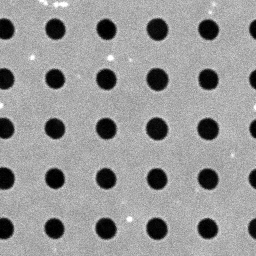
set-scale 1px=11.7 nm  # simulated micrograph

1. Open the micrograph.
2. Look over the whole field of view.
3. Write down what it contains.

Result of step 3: a regular array of holes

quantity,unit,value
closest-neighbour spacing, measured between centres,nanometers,578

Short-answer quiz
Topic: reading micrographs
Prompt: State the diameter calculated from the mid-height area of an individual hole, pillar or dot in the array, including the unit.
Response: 254 nm